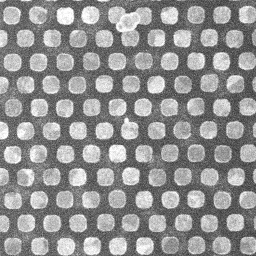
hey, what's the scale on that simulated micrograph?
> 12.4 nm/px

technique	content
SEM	a regular array of raised bodies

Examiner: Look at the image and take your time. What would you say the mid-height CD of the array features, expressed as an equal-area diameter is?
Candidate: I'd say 214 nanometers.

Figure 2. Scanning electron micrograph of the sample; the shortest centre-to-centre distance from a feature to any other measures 321 nm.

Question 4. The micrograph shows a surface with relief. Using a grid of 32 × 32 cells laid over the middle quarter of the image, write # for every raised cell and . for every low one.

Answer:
##...####..####...####...###...#
................................
................................
..###....###...###....###...###.
.####...####...####..####...####
..###...####...####..####...####
..###....###...###...####...###.
................................
................................
##...####...###...###....###...#
##...####..####...####..####...#
##...####..####...####..####...#
##....##....###...###....###....
................................
................................
..###...####...###...####...###.
..###...####...###...####...###.
..###...####...###...####...###.
..###....##....##.....##.....##.
................................
......##....###....##....###....
##...####...###...####...###...#
##...####...###...####...###...#
##...####...###...####...###...#
................................
................................
..###....###...###..........###.
..###...####...####...###...####
..###...####...####...###...####
..###....###...###...####...###.
................................
................................